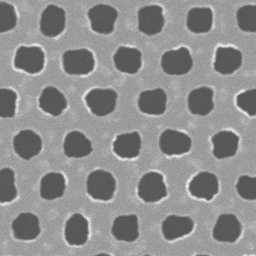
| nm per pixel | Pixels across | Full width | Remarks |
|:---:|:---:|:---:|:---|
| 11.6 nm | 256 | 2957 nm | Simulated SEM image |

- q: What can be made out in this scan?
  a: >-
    a regular array of holes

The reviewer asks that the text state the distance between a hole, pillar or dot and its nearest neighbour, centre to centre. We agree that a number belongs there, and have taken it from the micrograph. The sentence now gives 536 nanometers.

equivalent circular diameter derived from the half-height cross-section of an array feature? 332 nanometres